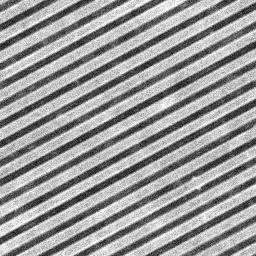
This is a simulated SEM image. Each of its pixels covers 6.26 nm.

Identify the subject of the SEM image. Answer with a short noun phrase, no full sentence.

parallel lines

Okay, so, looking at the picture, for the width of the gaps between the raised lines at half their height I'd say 0.0461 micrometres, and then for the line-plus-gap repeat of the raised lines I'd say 17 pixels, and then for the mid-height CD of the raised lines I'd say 62.6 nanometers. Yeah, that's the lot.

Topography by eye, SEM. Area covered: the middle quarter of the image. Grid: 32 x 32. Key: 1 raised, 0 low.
00001111100001111100001111100001
00011110000111110000111110000111
01111000011111100001111000011111
11110000111110000111100001111100
11000011111000011110000011111000
00001111100001111100001111100001
00111110000111110000111110000111
11111000011111000011111000011111
11100000111100001111100001111100
11000011110000111110000111110000
00001111000011111100001111100001
00111110000111110000111110000111
11111000011111000011111000011111
11100001111100001111100001111100
10000111110000111110000111110000
00011111000011111000011111000011
01111100000111110000111100001111
11111000011111000011110000111110
11100001111100001111100001111100
10000111110000111110000111110000
00011111000011111000011111000011
01111100001111100001111100001111
11111000011110000111110000111110
11100001111000011111000011111000
10000111100000111110000111110001
00011111000011111000011111000111
01111100001111100001111100001111
11110000111110000111110000111110
11000011111000011111000011111000
00001111100001111100000111100001
00111111000011111000011110000111
01111100001111100001111000011111